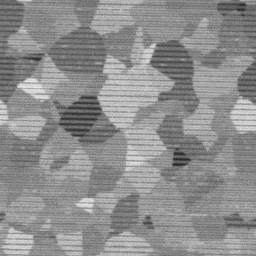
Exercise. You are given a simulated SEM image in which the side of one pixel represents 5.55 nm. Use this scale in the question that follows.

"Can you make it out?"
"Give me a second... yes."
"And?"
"parallel lines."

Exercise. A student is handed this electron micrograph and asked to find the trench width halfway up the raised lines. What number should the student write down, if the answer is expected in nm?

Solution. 12.5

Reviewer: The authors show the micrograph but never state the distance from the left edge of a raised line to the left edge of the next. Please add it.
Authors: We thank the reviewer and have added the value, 29.9 nm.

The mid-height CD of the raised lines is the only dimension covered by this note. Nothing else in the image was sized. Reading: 18 nanometres